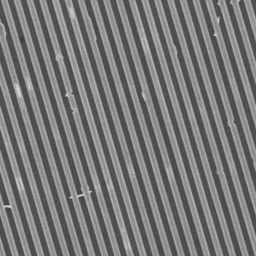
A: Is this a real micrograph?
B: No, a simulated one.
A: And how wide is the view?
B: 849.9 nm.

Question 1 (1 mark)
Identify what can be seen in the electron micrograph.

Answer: parallel lines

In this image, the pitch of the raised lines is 40.7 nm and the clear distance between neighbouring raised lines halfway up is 20.7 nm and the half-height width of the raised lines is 20.3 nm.